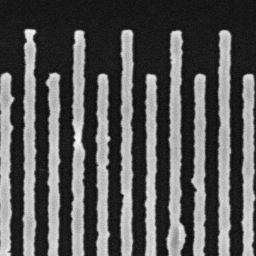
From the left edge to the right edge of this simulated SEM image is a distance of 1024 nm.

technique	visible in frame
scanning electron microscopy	parallel lines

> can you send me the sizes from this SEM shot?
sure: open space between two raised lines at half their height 13.4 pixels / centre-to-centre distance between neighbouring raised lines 97.3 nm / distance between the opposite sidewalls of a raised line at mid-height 0.0427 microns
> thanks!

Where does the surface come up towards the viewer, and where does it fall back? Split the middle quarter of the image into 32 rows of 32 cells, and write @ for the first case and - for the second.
--@@@----------@@----------@@---
--@@@----------@@----------@@---
--@@@----@-----@@----------@@---
--@@@----@@----@@----@@----@@---
--@@@----@@----@@----@@----@@---
---@@----@@----@@----@@----@@---
---@@----@@----@@----@@----@@---
---@@----@@----@@----@@----@@---
--@@@----@@----@@----@@----@@---
--@@@---@@@----@@----@@----@@---
--@@@---@@@---@@@----@@---@@@---
--@@@---@@@---@@@----@@----@@---
--@@@---@@@---@@@----@@----@@---
--@@@----@@----@@----@@----@@---
--@@@----@@---@@@----@@----@@---
--@@-----@@---@@@----@@----@@---
---@----@@@----@@----@@----@@---
---@----@@@----@@----@@----@@---
--@@----@@@----@@----@@---@@@---
---@----@@@----@@----@@---@@@---
--@@-----@@---@@@----@@----@@---
--@@@---@@@---@@@----@@----@@---
--@@@---@@@----@@----@@----@@---
--@@@---@@@----@@----@@----@@---
--@@@---@@@---@@@----@@----@@---
--@@@---@@@---@@@----@@----@@---
--@@@---@@@---@@@----@@----@@---
--@@@---@@@---@@@----@@----@@---
--@@@---@@@---@@@----@@----@@---
--@@@---@@@---@@@----@@----@@---
--@@@---@@@---@@@----@@----@@---
--@@@---@@@---@@@----@@----@@---